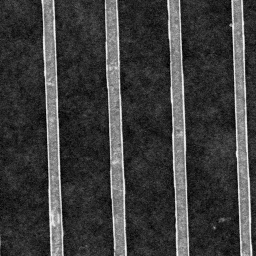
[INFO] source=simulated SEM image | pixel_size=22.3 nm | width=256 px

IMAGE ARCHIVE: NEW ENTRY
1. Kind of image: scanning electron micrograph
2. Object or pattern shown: one or a few lines or trenches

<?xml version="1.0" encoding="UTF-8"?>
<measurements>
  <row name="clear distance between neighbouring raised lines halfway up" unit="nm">1160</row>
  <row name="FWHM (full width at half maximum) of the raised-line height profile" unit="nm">248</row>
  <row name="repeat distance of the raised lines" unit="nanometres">1410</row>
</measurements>